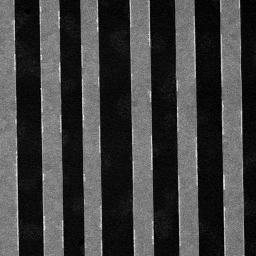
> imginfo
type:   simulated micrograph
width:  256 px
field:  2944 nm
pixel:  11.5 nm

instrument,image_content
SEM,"parallel lines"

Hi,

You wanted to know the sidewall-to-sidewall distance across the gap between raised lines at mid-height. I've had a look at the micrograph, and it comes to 295 nanometers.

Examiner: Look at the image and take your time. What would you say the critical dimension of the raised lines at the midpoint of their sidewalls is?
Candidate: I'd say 227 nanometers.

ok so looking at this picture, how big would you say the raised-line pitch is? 518 nm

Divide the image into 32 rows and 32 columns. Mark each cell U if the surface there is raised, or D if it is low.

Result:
UUDDDUUDDDUUDDDDUUUDDDUUDDDDUUDD
UUDDDUUDDDUUDDDDUUUDDDUUDDDDUUDD
UUDDDUUDDDUUDDDDUUUDDDUUDDDDUUDD
UUDDDUUDDDUUDDDDUUUDDDUUDDDDUUDD
UUDDDUUDDDUUDDDDUUUDDDUUDDDDUUDD
UUDDDUUDDDUUDDDDUUUDDDUUDDDDUUDD
UUDDDUUDDDUUDDDDUUUDDDUUDDDDUUDD
UUDDDUUDDDUUDDDDUUUDDDUUDDDDUUDD
UUDDDUUDDDUUDDDDUUUDDDUUDDDDUUDD
UUDDDUUUDDUUDDDDUUUDDDUUDDDDUUDD
UUDDDUUUDDUUDDDDUUUDDDUUDDDDUUDD
UUDDDUUUDDUUDDDDUUUDDDUUDDDDUUDD
UUDDDUUUDDUUDDDDUUUDDDUUDDDDUUDD
UUDDDUUUDDUUDDDDDUUDDDUUDDDDUUDD
UUDDDUUUDDUUDDDDDUUDDDUUUDDDUUDD
UUDDDUUUDDUUDDDDDUUDDDUUUDDDUUDD
UUDDDUUUDDUUDDDDDUUDDDUUUDDDUUDD
UUDDDUUUDDUUDDDDDUUDDDUUUDDDUUDD
UUDDDUUUDDUUUDDDDUUDDDUUUDDDUUDD
UUDDDUUUDDUUUDDDDUUDDDUUUDDDUUDD
UUDDDUUUDDUUUDDDDUUDDDUUUDDDUUDD
UUDDDUUUDDUUUDDDDUUDDDUUUDDDUUDD
UUDDDUUUDDDUUDDDDUUDDDUUUDDDUUDD
UUDDDUUUDDDUUDDDDUUDDDUUUDDDUUDD
UUDDDUUUDDDUUDDDDUUDDDUUUDDDUUDD
UUDDDUUUDDDUUDDDDUUDDDUUUDDDUUDD
UUDDDUUUDDDUUDDDDUUDDDUUUDDDUUDD
UUDDDUUUDDDUUDDDDUUDDDUUUDDDUUDD
UUDDDUUUDDDUUDDDDUUUDDUUUDDDUUDD
UUDDDUUUDDDUUDDDDUUDDDUUUDDDUUDD
UUDDDDUUDDDUUDDDDUUDDDUUUDDDUUDD
UUDDDDUUDDDUUDDDDUUDDDUUUDDDUUDD